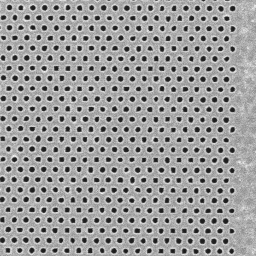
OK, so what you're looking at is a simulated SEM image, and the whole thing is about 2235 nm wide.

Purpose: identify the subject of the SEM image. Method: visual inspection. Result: a regular array of holes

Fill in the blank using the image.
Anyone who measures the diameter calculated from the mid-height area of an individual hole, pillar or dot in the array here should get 0.0493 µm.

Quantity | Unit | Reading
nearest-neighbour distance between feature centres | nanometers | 97.9